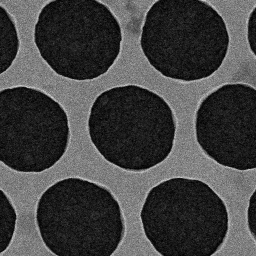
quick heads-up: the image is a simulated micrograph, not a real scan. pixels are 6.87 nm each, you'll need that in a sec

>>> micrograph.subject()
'holes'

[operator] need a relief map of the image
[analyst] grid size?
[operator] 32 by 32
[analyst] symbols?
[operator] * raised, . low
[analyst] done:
******.......******.......******
.****.........*****........****.
..***..........***..........***.
..**...........***..........***.
..**...........***...........**.
..**...........***...........**.
..***..........***..........****
..****........*****.........****
.******.......*****........*****
********....*********.....******
*****************************.**
.....********......********.....
.......*****........******......
........***..........****.......
........***...........***.......
.........**...........**........
.........**...........**........
.........**...........***.......
........****.........****.......
........*****........*****......
*......*******......********....
********************************
********..***********...********
******.......******.......******
.****.........****.........****.
.****..........***..........***.
..***..........***..........***.
..***..........***..........***.
..***..........***..........***.
..***..........***..........****
.*****.........****.........****
*******.......******.......*****